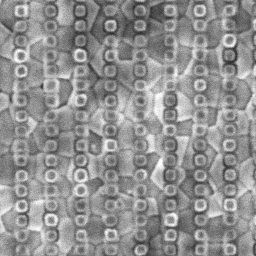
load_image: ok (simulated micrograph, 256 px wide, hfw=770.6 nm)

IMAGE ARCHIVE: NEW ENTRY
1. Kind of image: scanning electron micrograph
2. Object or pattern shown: a regular array of raised bodies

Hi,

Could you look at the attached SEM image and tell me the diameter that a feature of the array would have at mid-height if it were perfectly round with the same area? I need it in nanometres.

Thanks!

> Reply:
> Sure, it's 33.3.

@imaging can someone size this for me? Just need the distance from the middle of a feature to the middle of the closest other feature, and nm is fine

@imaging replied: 44.6